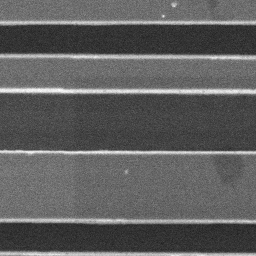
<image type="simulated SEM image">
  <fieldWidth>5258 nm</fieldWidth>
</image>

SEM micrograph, lines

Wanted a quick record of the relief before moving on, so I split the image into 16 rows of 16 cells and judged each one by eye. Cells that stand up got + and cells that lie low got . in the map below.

++++++++++++++++
................
................
................
++++++++++++++++
++++++++++++++++
................
................
................
................
++++++++++++++++
++++++++++++++++
++++++++++++++++
++++++++++++++++
................
................